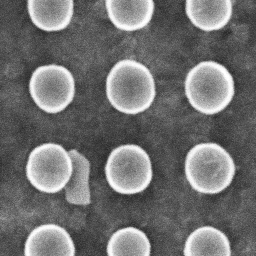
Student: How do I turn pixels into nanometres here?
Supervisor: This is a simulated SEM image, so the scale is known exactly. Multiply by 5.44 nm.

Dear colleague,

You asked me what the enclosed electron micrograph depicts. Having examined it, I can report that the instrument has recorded raised bodies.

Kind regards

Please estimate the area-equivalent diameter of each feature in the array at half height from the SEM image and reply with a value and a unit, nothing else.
250 nanometers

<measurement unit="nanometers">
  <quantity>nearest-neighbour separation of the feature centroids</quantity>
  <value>430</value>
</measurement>